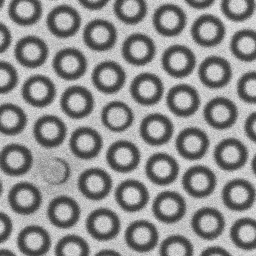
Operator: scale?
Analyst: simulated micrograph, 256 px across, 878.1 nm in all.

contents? a regular array of ring-shaped grooves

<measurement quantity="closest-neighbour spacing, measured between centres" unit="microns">0.133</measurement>